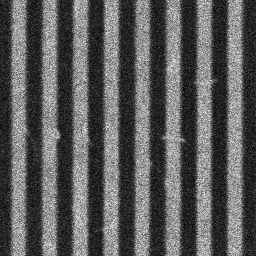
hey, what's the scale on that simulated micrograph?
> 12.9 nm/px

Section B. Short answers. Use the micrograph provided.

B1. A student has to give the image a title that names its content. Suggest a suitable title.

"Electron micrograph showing parallel lines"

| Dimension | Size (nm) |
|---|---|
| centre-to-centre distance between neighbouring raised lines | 398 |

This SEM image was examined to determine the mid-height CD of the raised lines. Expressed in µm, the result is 0.203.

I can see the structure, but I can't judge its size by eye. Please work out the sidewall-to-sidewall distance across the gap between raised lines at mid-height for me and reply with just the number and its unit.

193 nm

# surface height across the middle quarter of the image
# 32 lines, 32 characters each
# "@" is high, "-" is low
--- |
--@@@@----@@@@----@@@@----@@@---
--@@@@----@@@@----@@@@----@@@---
--@@@@----@@@@----@@@-----@@@---
--@@@@----@@@@----@@@-----@@@---
--@@@@----@@@@----@@@-----@@@---
--@@@@----@@@@----@@@-----@@@---
--@@@@----@@@@----@@@-----@@@---
--@@@@----@@@@----@@@-----@@@---
--@@@@----@@@@----@@@-----@@@---
--@@@@----@@@@----@@@-----@@@---
--@@@@----@@@@----@@@-----@@@---
--@@@@----@@@@----@@@-----@@@---
--@@@@----@@@@----@@@-----@@@---
--@@@@----@@@@----@@@-----@@@---
--@@@@----@@@@----@@@-----@@@---
--@@@@----@@@@----@@@-----@@@---
--@@@@----@@@@----@@@-----@@@---
--@@@@----@@@@----@@@-----@@@---
--@@@@----@@@@----@@@----@@@@---
--@@@@----@@@@----@@@----@@@@---
--@@@@----@@@@----@@@----@@@@---
--@@@@----@@@@----@@@----@@@@---
--@@@@----@@@@----@@@----@@@@---
--@@@@----@@@@----@@@----@@@@---
--@@@@----@@@@----@@@@---@@@@---
--@@@@----@@@@----@@@@---@@@@---
--@@@@----@@@@----@@@----@@@@---
--@@@@----@@@@----@@@----@@@@---
--@@@@----@@@@----@@@----@@@@---
--@@@@----@@@@----@@@----@@@@---
--@@@@----@@@@----@@@----@@@@---
--@@@@----@@@@----@@@----@@@@---